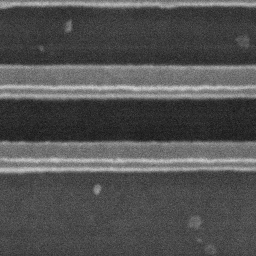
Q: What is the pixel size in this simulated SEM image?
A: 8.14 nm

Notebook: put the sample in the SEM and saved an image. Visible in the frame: lines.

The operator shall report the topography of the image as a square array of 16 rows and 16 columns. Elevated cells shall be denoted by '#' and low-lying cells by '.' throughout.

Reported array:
................
................
................
................
################
################
................
................
................
################
################
................
................
................
................
................